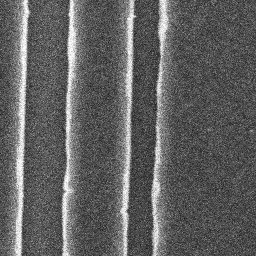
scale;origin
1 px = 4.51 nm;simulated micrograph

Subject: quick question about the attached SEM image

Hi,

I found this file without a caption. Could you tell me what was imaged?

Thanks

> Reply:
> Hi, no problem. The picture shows one or a few lines or trenches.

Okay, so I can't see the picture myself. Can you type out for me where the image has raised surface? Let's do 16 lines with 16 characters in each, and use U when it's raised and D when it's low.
UUDDUUUUDDUUUUUU
UUDDUUUUDDUUUUUU
UUDDUUUUDDUUUUUU
UUDDUUUUDDUUUUUU
UUDDUUUUDDUUUUUU
UDDDUUUUDDUUUUUU
UDDDUUUUDDUUUUUU
UDDDUUUUDDUUUUUU
UDDDUUUUDDUUUUUU
UDDDUUUUDDUUUUUU
UDDDUUUUDDUUUUUU
UDDDUUUUDDUUUUUU
UDDDUUUUDDUUUUUU
UDDDUUUUDDUUUUUU
UDDDUUUUDDUUUUUU
UDDDUUUUDDUUUUUU